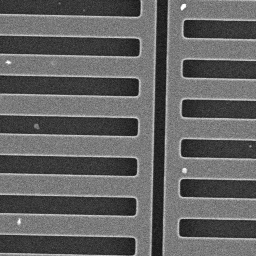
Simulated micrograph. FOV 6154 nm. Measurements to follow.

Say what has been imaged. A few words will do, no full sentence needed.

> groups of lines, slits or small figures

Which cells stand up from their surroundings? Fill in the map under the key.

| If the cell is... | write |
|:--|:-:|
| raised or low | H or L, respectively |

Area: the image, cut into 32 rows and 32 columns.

LLLLLLLLLLLLLLLLLLHHLHHHHHHHHHHH
LLLLLLLLLLLLLLLLLLHHLHHHHHHHHHHH
HHHHHHHHHHHHHHHHHHHHLHHHLLLHHHHH
HHHHHHHHHHHHHHHHHHHLLHHLLLLLLLLL
LLLHHHHHHHHHHHHHHHHLLHHLLLLLLLLL
LLLLLLLLLLLLLLLLLHHLLHHHHHHHHHHH
LLLLLLLLLLLLLLLLLHHLLHHHHHHHHHHH
HHHHHHHHHHHHHHHHHHHLLHHLLLLLLLHH
HHHHHHHHHHHHHHHHHHHLLHHLLLLLLLLL
LLLLLLHHHHHHHHHHHHHLLHHLLLLLLLLL
LLLLLLLLLLLLLLLLLHHLLHHHHHHHHHHH
LLLLLLLLLLLLLLLLLHHLLHHHHHHHHHHH
HHHHHHHHHHHHHHHHHHHLLHHLLLLLHHHH
HHHHHHHHHHHHHHHHHHHLLHHLLLLLLLLL
LLLLLLLLLHHHHHHHHHHLLHHLLLLLLLLL
LLLLLLLLLLLLLLLLLHHLLHHHHHHHHHHH
LLLLLLLLLLLLLLLLLHHLLHHHHHHHHHHH
HHHHHHHHHHHHHHHHHHHLLHHLLLLLLLLH
HHHHHHHHHHHHHHHHHHHLLHLLLLLLLLLL
LLLLLLLHHHHHHHHHHHHLLHHLLLLLLLLL
LLLLLLLLLLLLLLLLLHHLLHHHHHHHHHHH
LLLLLLLLLLLLLLLLLHHLLHHHHHHHHHHH
HHHHHHHHHHHHHHHHHHHLLHHLLLLLLLLL
HHHHHHHHHHHHHHHHHHHLLHLLLLLLLLLL
LLLLLLLLLLHHHHHHHHHLLHHLLLLLLLLL
LLLLLLLLLLLLLLLLLHHLLHHHHHHHHHHH
LLLLLLLLLLLLLLLLLHHLHHHHHHHHHHHH
HHHHHHHHHHHHHHHHHHHLHHHLLLLLLLLH
HHHHHHHHHHHHHHHHHHHLHHLLLLLLLLLL
LLLLLLLLLLLLLHHHHHHLHHHLLLLLLLLL
LLLLLLLLLLLLLLLLLHHLHHHHHHHHHHHH
LLLLLLLLLLLLLLLLLHHLHHHHHHHHHHHH